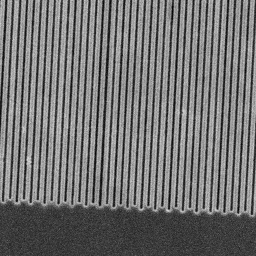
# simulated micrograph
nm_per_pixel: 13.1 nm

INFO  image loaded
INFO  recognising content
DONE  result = parallel lines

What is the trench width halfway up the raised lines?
37.6 nm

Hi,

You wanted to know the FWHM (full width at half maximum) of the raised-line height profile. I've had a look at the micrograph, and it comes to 50.6 nanometers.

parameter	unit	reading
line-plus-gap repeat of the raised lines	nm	90.6